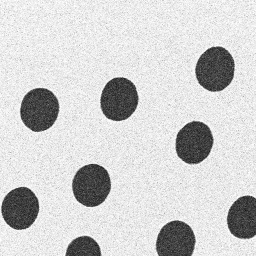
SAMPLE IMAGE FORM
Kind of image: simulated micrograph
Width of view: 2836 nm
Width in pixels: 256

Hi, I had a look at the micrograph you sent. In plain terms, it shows holes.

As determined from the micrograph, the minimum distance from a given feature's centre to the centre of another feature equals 846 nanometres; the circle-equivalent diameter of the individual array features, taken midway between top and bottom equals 455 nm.